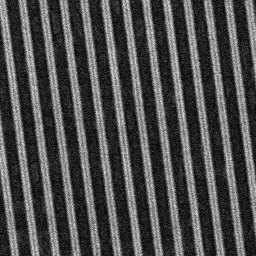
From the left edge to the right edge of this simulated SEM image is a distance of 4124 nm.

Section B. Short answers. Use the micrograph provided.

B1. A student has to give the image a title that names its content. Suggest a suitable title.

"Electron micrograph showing parallel lines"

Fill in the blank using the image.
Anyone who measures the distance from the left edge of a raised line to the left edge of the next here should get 328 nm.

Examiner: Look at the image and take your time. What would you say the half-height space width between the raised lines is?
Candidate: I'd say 224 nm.